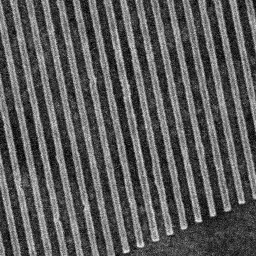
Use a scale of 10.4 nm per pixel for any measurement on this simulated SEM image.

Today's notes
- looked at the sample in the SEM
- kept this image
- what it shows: parallel lines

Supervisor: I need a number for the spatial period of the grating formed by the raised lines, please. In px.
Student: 15.4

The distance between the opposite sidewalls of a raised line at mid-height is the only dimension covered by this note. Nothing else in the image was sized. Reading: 57.5 nanometres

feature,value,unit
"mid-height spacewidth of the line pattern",106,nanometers